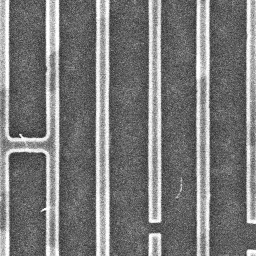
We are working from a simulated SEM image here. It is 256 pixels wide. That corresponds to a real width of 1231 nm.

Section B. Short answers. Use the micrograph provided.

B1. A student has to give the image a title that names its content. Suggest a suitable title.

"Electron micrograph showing parallel lines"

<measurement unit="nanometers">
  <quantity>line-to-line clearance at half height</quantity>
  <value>193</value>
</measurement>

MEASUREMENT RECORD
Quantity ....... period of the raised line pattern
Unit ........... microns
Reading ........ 0.241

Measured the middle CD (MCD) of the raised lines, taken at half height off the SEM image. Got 0.0493 micrometres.